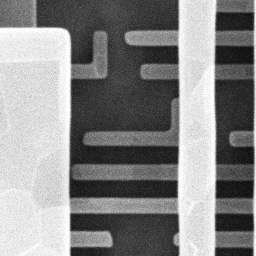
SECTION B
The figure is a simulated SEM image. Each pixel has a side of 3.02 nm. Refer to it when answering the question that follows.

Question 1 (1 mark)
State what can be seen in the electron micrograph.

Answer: wiring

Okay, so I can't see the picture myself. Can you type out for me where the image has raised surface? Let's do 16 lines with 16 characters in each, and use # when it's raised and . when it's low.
...........##...
...........##...
####.......##...
####.......##...
####.......##...
####.......##...
####.......##...
####.......##...
####.......##...
####.......##...
####.......##...
####.......##...
####.......##...
####.......##...
####.......##...
####.......##...